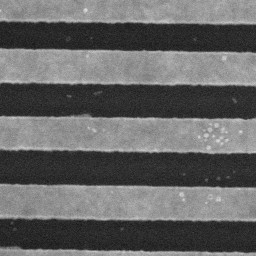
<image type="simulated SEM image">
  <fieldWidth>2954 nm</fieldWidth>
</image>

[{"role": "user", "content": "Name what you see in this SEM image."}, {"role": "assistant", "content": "lines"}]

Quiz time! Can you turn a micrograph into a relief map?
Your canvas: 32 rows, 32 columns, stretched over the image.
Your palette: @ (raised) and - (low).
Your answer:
@@@@@@@@@@@@@@@@@@@@@@@@@@@@@@@@
@@@@@@@@@@@@@@@@@@@@@@@@@@@@@@@@
@@@@@@@@@@@@@@@@@@@@@@@@@@@@@@@@
--------------------------------
--------------------------------
--------------------------------
@@@@@@@@@@@@@@@@@@@@@@@@--------
@@@@@@@@@@@@@@@@@@@@@@@@@@@@@@@@
@@@@@@@@@@@@@@@@@@@@@@@@@@@@@@@@
@@@@@@@@@@@@@@@@@@@@@@@@@@@@@@@@
-------------@----@@@@-@@@@@@@@@
--------------------------------
--------------------------------
--------------------------------
--------------------------------
@@@@@@@@@@@@@@@@@@@@@@@@@@@@@@@@
@@@@@@@@@@@@@@@@@@@@@@@@@@@@@@@@
@@@@@@@@@@@@@@@@@@@@@@@@@@@@@@@@
@@@@@@@@@@@@@@@@@@@@@@@@@@@@@@@@
--------------------------------
--------------------------------
--------------------------------
--------------------------------
@@@@@@@@@@@@@@@@@@@@@@@@@@@@----
@@@@@@@@@@@@@@@@@@@@@@@@@@@@@@@@
@@@@@@@@@@@@@@@@@@@@@@@@@@@@@@@@
@@@@@@@@@@@@@@@@@@@@@@@@@@@@@@@@
------------@---@@@@@@@@@@@@@@@@
--------------------------------
--------------------------------
--------------------------------
@@@@@@@@@@@@@@@@@@--------------